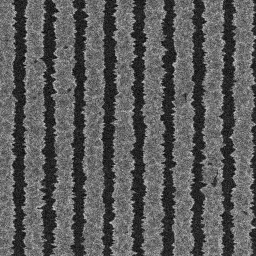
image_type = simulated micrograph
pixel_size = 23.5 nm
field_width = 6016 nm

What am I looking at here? parallel lines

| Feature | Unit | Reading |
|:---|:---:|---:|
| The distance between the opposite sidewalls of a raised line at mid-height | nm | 408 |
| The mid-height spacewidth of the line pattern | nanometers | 279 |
